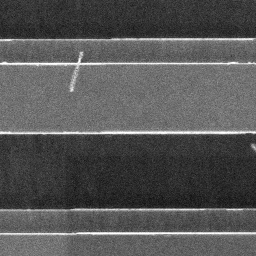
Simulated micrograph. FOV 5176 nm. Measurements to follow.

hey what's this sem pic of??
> lines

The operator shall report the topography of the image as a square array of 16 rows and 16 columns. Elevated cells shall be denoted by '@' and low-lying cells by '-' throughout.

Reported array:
----------------
----------------
@@@@@@@@@@@@@@@@
@@@@@@@@@@@@@@@@
@@@@@@@@@@@@@@@@
@@@@@@@@@@@@@@@@
@@@@@@@@@@@@@@@@
@@@@@@@@@@@@@@@@
----------------
----------------
----------------
----------------
----------------
@@@@@@@@@@@@@@@@
@@@@@@@@@@@@@@@@
@@@@@@@@@@@@@@@@